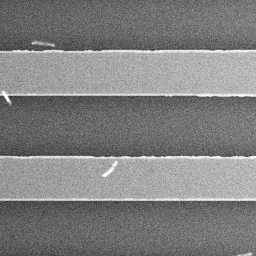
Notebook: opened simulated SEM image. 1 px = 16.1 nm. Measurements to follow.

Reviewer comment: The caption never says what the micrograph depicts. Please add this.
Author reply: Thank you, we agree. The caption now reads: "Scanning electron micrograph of lines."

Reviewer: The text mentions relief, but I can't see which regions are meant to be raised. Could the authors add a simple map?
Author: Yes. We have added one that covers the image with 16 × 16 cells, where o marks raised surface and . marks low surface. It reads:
................
................
................
oooooooooooooooo
oooooooooooooooo
oooooooooooooooo
................
................
................
................
oooooooooooooooo
oooooooooooooooo
................
................
................
................